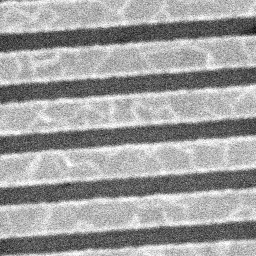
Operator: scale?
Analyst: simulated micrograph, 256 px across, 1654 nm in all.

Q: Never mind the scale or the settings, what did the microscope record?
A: lines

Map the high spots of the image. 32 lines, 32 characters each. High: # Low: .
################################
################################
#######################.........
##########......................
................................
..................##############
..##############################
################################
###########################.....
##############..................
................................
......................##########
.......#########################
################################
###############################.
###################.............
####............................
...........................#####
.............###################
################################
################################
########################........
##########......................
................................
...................#############
.......#########################
################################
###############################.
################................
###.............................
.........................#######
..........######################